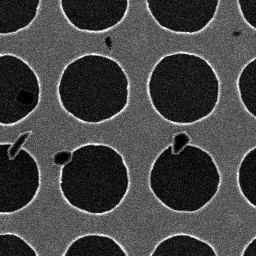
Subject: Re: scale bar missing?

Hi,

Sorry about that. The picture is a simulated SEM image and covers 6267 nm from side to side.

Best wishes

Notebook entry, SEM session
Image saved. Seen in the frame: holes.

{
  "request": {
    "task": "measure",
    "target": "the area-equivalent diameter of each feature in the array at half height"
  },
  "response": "1670 nanometres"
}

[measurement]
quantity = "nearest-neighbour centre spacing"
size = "2.2 um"